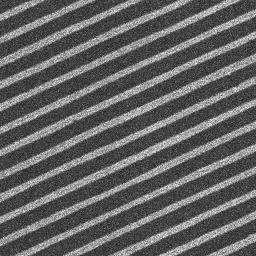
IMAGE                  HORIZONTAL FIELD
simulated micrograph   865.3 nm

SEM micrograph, parallel lines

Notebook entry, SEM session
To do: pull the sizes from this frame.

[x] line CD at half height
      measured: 19.5 nanometres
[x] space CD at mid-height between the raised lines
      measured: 49.1 nanometres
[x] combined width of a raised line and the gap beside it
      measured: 68.9 nm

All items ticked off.